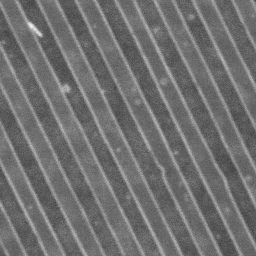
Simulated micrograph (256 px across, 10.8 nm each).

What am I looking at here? parallel lines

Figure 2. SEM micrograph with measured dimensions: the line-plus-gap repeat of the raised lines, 378 nm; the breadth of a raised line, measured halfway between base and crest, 192 nanometers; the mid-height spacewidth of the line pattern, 17.7 pixels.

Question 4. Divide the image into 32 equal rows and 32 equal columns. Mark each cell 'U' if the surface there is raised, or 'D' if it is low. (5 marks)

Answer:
UUDDDUUDDDUUDDDUUDDDUUDDUUUDDUUU
DUUDDUUUDDUUUDDUUDDDUUDDDUUDDDUU
DUUDDDUUDDDUUDDDUUDDUUUDDUUUDDUU
DUUUDDUUUDDUUUDDUUDDDUUDDDUUDDDU
DDUUDDDUUDDDUUDDDUUDDUUUDDUUUDDU
DDDUUDDUUUDDUUUDDUUDDDUUDDDUUDDD
DDDUUDDDUUDDDUUDDDUUDDUUUDDUUUDD
UDDDUUDDUUUDDUUUDDUUDDDUUDDDUUDD
UDDDUUDDDUUDDDUUDDDUUDDDUUDDUUUD
UUDDUUUDDUUUDDUUUDDUUDDDUUDDDUUD
UUDDDUUDDDUUDDDUUDDDUUDDDUUDDUUU
DUUDDUUUDDUUUDDUUUDDUUDDDUUDDDUU
DUUDDDUUDDDUUDDDUUDDDUUDDDUUDDUU
DDUUDDUUUDDUUUDDUUUDDUUDDDUUDDDU
DDUUDDDUUDDDUUDDDUUDDDUUDDDUUDDU
DDUUUDDUUUDDUUUDDUUUDDUUDDDUUDDD
UDDUUDDDUUDDDUUDDDUUDDDUUDDDUUDD
UDDUUUDDUUUDDUUUDDUUUDDUUDDDUUDD
UDDDUUDDDUUDDDUUDDDUUDDDUUDDUUUD
UUDDUUUDDUUUDDUUUDDUUUDDUUDDDUUD
UUDDDUUDDDUUDDDUUDDDUUDDUUUDDUUU
DUUDDUUUDDUUUDDUUUDDUUDDDUUUDDUU
DUUDDDUUDDDUUDDDUUDDDUUDDUUUDDUU
DDUUDDUUUDDUUUDDUUUDDUUDDDUUDDDU
DDUUDDDUUDDDUUDDDUUDDDUUDDDUUDDU
DDDUUDDUUUDDUUUDDUUUDDUUDDDUUDDD
UDDUUDDDUUDDDUUDDDUUDDDUUDDUUUDD
UDDDUUDDUUUDDUUUDDUUDDDUUDDDUUDD
UUDDUUDDDUUDDDUUDDDUUDDDUUDDUUUD
UUDDDUUDDUUUDDUUUDDUUDDDUUDDDUUD
UUUDDUUDDDUUDDDUUDDDUUDDDUUDDUUU
DUUDDDUUDDDUUDDUUUDDUUDDDUUDDDUU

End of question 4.